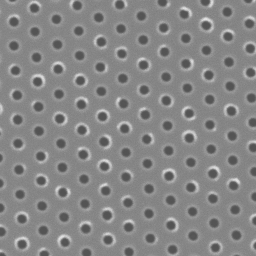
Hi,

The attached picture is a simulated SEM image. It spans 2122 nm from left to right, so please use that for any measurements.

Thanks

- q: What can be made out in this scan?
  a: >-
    a regular array of holes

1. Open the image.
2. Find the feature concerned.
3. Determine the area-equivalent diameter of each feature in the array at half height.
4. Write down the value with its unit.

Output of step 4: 0.0805 um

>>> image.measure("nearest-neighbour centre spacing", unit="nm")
200